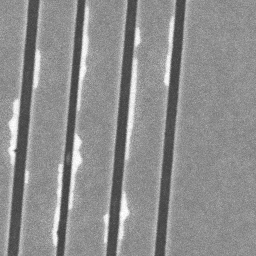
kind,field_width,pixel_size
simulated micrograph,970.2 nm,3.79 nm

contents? parallel lines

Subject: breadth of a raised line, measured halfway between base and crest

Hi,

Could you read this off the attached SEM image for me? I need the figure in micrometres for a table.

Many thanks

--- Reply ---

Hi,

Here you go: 0.142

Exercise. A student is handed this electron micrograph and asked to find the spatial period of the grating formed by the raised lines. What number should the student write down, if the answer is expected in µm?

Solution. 0.185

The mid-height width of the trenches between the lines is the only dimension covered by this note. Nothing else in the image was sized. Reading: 41 nanometers